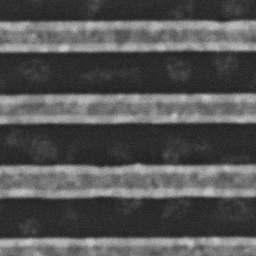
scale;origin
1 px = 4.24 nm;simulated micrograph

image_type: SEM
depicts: one or a few lines or trenches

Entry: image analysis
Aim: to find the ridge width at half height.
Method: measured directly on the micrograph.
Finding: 94.8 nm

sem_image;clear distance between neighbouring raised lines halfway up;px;49.1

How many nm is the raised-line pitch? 307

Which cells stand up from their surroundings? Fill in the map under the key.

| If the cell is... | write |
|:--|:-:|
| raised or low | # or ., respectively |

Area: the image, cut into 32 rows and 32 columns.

................................
................................
................................
################################
################################
################################
................................
................................
................................
................................
................................
................................
################################
################################
################################
................................
................................
................................
................................
................................
................................
################################
################################
################################
................................
................................
................................
................................
................................
................................
################################
################################